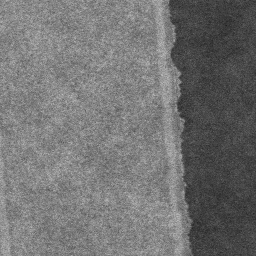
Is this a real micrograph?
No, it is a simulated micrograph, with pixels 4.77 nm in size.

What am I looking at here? one or a few lines or trenches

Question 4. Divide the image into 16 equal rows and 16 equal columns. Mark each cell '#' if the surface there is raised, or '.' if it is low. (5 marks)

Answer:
##########......
##########......
##########......
##########......
##########......
##########......
##########......
##########......
###########.....
###########.....
###########.....
###########.....
###########.....
###########.....
###########.....
###########.....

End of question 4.